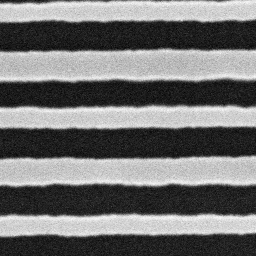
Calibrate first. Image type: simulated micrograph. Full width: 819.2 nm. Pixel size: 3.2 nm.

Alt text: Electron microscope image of lines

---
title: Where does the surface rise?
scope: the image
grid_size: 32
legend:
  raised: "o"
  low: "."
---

......oooooooooooooooooooooooooo
oooooooooooooooooooooooooooooooo
ooooo..oooooooooooooooo.oooo..o.
................................
................................
................................
....o.oooooooooooooooooooooooooo
oooooooooooooooooooooooooooooooo
oooooooooooooooooooooooooooooooo
oooooooooooooooooooooooooooooooo
................................
................................
................................
...................o..o.....o...
oooooooooooooooooooooooooooooooo
oooooooooooooooooooooooooooooooo
................................
................................
................................
................................
oooooooooooooooooooooooooooooooo
oooooooooooooooooooooooooooooooo
oooooooooooooooooooooooooooooooo
................................
................................
................................
................................
oooooooooooooooooooooooooooooooo
oooooooooooooooooooooooooooooooo
................................
................................
................................